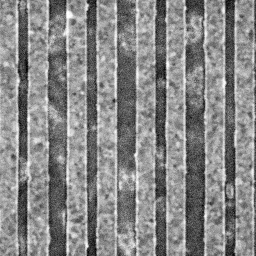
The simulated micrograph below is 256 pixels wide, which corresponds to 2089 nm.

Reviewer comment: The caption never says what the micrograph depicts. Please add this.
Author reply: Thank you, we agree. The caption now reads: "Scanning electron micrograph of parallel lines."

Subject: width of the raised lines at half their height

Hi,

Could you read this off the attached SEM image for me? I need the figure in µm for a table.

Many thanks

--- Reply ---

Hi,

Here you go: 0.151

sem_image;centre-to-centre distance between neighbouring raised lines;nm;281